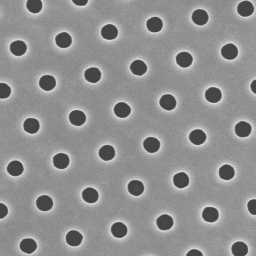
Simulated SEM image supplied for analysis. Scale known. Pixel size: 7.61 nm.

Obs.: a regular array of holes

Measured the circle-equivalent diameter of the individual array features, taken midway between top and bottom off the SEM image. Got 122 nanometres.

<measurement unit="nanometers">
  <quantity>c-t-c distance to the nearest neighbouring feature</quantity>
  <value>345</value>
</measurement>